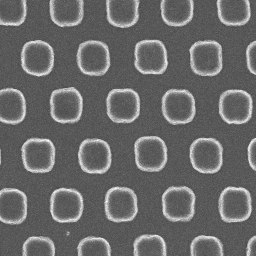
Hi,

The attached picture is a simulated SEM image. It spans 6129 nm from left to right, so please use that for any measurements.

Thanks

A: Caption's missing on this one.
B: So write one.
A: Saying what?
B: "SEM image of a regular array of raised bodies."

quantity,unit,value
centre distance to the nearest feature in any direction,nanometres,1320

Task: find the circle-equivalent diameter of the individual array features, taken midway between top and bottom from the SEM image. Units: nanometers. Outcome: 798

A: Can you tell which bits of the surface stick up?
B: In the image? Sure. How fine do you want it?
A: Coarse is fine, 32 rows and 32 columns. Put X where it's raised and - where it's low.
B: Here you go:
XXX---XXXX---XXXX---XXXX---XXXX-
XXX---XXXX---XXXX---XXXX---XXXX-
XXX----XXX----XXX----XXX----XXX-
--------------------------------
--------------------------------
----XX-----XX----XXX-----XX-----
---XXX----XXXX---XXXX---XXXX---X
---XXXX---XXXX---XXXX---XXXX---X
---XXX----XXX----XXXX---XXXX---X
--------------------------------
--------------------------------
XX-----XXX----XXX----XX------X--
XXX---XXXX----XXX---XXXX----XXX-
XXX----XXX----XXX---XXXX----XXX-
XXX----XXX----XXX----XXX----XXX-
--------------------------------
--------------------------------
------------------XX-----X------
---XXXX---XXX----XXXX---XXXX---X
---XXXX---XXXX---XXXX---XXXX---X
---XXXX---XXXX---XXX----XXXX---X
--------------------------------
--------------------------------
-----------------------------X--
XXX----XXX---XXXX----XXX----XXX-
XXX---XXXX---XXXX----XXX----XXX-
XXX---XXXX---XXXX----XXX----XXX-
XXX----XX-----XX------------XX--
--------------------------------
--------------------------------
---XXX----XXX----XXXX---XXX----X
---XXXX---XXXX---XXXX---XXXX---X